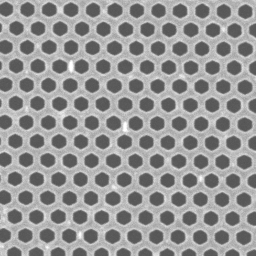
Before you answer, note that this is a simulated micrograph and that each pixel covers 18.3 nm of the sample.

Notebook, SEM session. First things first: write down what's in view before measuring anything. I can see a regular array of holes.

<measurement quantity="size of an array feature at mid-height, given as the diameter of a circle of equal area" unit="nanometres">273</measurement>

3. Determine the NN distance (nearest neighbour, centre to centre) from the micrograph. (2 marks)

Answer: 392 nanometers